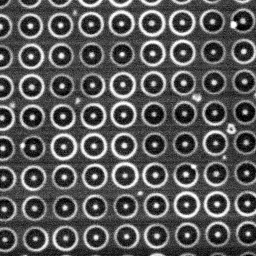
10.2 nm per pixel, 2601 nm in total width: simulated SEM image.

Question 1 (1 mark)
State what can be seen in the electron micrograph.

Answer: an array of small figures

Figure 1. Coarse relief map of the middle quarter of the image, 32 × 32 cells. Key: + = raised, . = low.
++++++++++++++++++++++++++++++++
++++++++++++++++++++++++++++++++
++++++++++++++..+++++...++++...+
.++++....++++....+++.....+++....
..+++.....++.....+++.....++.....
..++......++......++.....++.....
..+++.....++.....+++.....+++....
.+++++...++++...+++++..+++++++++
++++++++++++++++++++++++++++++++
++++++++++++++++++++++++++++++++
.+++++...++++....++++...++++....
..+++.....++.....+++.....+++....
..+++.....++......++.....++.....
..+++.....++......++.....+++....
..+++.....+++....++++...+++++...
.+++++...+++++.+++++++++++++++++
++++++++++++++++++++++++++++++++
+++++++++++++++++++++++++++++..+
..++++...++++....++++....+++....
...++.....++......++.....+++....
...+......++......++.....+++....
...++.....++......++.....+++....
..+++.....+++....++++...+++++..+
.+++++++++++++++++++++++++++++++
++++++++++++++++++++++++++++++++
+++++++..+++++...++++...+++++...
..+++.....+++.....++.....+++....
...++.....++......++......++....
...++.....+++.....++.....+++....
...++.....+++.....+++....+++....
..++++...+++++..++++++..++++++.+
++++++++++++++++++++++++++++++++